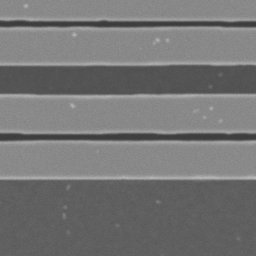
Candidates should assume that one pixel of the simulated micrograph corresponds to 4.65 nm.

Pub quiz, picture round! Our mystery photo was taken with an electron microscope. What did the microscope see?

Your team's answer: lines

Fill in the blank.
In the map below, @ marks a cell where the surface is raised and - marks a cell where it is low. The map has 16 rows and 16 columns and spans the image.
@@@@@@@@@@@@@@@@
@@@@@@@@@@@@@@@@
@@@@@@@@@@@@@@@@
@@@@@@@@@@@@@@@@
----------------
----------------
@@@@@@@@@@@@@@@@
@@@@@@@@@@@@@@@@
@@@@@@@@@@@@@@@@
@@@@@@@@@@@@@@@@
@@@@@@@@@@@@@@@@
----------------
----------------
----------------
----------------
----------------